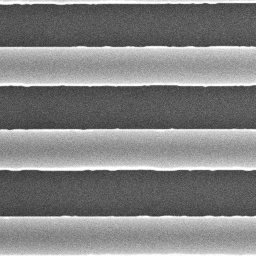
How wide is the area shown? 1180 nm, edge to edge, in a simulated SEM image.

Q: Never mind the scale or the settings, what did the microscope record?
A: lines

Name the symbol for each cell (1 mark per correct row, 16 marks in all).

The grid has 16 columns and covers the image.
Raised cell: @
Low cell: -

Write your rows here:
----------------
----------------
----------------
@@@@@@@@@@@@@@@@
@@@@@@@@@@@@@@@@
----------------
----------------
----------------
@@@@@@@@@@@@@@@@
@@@@@@@@@@@@@@@@
@@@@@@@@@@@@@@@@
----------------
----------------
----------------
@@@@@@@@@@@@@@@@
@@@@@@@@@@@@@@@@